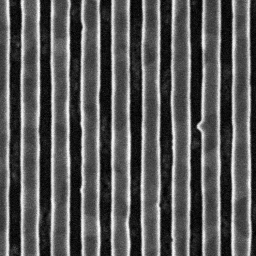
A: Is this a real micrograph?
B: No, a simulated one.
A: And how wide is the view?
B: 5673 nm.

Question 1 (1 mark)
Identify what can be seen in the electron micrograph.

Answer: parallel lines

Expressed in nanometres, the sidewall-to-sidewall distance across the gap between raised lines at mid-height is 296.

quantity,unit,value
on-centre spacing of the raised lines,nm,668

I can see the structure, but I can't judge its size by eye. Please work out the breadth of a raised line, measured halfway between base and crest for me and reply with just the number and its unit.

381 nm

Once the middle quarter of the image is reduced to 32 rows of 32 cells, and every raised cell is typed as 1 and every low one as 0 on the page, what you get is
10000111100011110000111100011110
10000111100011110000111100011110
10000111100011110000111100011110
10000111100011110000111100011110
10000111100011110000111100011110
10000111100011110000111100011110
10000111100011110000111100011110
10000111100011110000111100011110
10000111000011110000111100011110
10000111000011110000111100011110
10000111000011110000111100011110
10000111000011110000111100011110
10000111100011110000111100011110
10000111100011110000111100011110
10000111100011110000111100011110
10000111100011110000111100011110
10000111100011110000111100001110
10000111100011110000111100001110
10000111000011110000111000001110
10000111000011110000111100001110
10000111000011110000111100001110
10000111000011110000111100001110
10000111100011110000111100011110
10000111100011110000111100011110
10000111100011110000111100011110
10000111100011110000111100011110
10000111100011110000111100011110
10000111100011110000111100011110
10000111100011110000111100011110
10000111100011110000111100011110
10000111100011110000111100011110
10001111100011110000111100011110